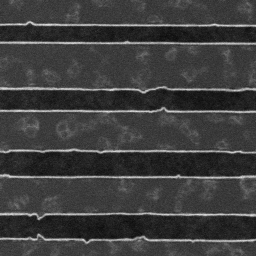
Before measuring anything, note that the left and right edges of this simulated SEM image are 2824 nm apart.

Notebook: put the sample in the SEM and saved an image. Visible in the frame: one or a few lines or trenches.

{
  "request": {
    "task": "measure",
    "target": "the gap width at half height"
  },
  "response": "438 nanometers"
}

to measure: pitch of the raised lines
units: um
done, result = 0.709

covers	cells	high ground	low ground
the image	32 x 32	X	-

--------------------------------
--------------------------------
--------------------------------
XXXXXXXXXXXXXXXXXXXXXXXXXXXXXXXX
XXXXXXXXXXXXXXXXXXXXXXXXXXXXXXXX
--------------------------------
--------------------------------
--------------------------------
--------------------------------
--------------------------------
--------------------------------
XXXXXXXXXXXXXXXXXXXXXXXXXXXXXXXX
XXXXXXXXXXXXXXXXXXXXXXXXXXXXXXXX
XXXXXXXXXXXXXXXXXXXXXXXXXXXXXXXX
--------------------------------
--------------------------------
--------------------------------
--------------------------------
--------------------------------
XXXXXXXXXXXXXXXXXXXXXXXXXXXXXXXX
XXXXXXXXXXXXXXXXXXXXXXXXXXXXXXXX
XXXXXXXXXXXXXXXXXXXXXXXXXXXXXXXX
--------------------------------
--------------------------------
--------------------------------
--------------------------------
--------------------------------
XXXXXXXXXXXXXXXXXXXXXXXXXXXXXXXX
XXXXXXXXXXXXXXXXXXXXXXXXXXXXXXXX
XXXXXXXXXXXXXXXXXXXXXXXXXXXXXXXX
--------------------------------
--------------------------------